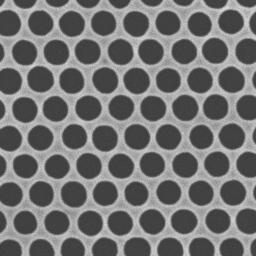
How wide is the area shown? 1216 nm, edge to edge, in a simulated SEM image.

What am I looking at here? a regular array of holes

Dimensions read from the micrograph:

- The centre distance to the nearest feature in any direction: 0.148 µm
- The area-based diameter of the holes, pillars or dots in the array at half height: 122 nm